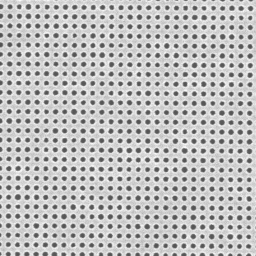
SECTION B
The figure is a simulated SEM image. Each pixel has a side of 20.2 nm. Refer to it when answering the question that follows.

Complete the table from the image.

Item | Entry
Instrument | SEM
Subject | a regular array of holes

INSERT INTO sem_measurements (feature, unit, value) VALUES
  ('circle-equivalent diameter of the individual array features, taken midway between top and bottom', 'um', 0.112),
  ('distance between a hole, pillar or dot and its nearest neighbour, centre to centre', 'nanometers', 180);